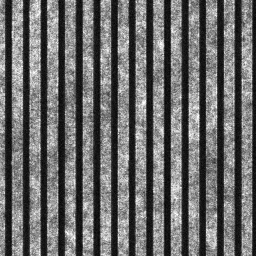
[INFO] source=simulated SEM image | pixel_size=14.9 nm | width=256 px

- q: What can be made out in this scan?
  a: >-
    parallel lines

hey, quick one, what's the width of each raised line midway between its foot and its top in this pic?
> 173 nm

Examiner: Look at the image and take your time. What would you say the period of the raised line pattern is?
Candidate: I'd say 263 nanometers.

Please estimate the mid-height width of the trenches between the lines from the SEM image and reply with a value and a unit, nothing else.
93.1 nm